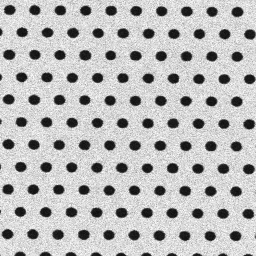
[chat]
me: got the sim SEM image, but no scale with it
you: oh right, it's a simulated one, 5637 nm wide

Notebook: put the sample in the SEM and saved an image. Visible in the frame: a regular array of holes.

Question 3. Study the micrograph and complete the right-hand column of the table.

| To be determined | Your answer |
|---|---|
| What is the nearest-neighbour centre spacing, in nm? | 556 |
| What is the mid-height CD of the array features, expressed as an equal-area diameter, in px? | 10.9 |